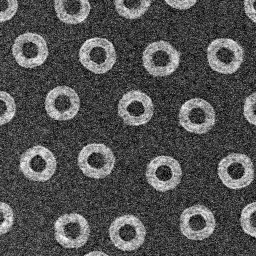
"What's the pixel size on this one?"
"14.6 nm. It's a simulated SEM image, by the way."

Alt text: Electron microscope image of a regular array of ring-shaped raised bodies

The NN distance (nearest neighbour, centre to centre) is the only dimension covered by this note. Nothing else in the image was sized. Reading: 872 nm